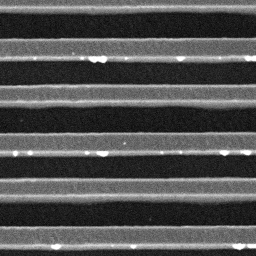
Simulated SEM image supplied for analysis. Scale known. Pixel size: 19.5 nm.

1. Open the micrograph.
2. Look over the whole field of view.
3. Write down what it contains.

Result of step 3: lines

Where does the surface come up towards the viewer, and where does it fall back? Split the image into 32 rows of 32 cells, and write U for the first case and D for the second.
UUUUUUUUUUUUUUUUUUUUUUUUUUUUUUUU
DDDDDDDDDDDDDDDDDDDDDDDDDDDDDDDD
DDDDDDDDDDDDDDDDDDDDDDDDDDDDDDDD
DDDDDDDDDDDDDDDDDDDDDDDDDDDDDDDD
DDDDDDDDDDDDDDDDDDDDDDDDDDDDDDDD
UUUUUUUUUUUUUUUUUUUUUUUUUUUUUUUU
UUUUUUUUUUUUUUUUUUUUUUUUUUUUUUUU
DDDDDDDDDDDUUDDDDDDDDDDDDDDDDDDU
DDDDDDDDDDDDDDDDDDDDDDDDDDDDDDDD
DDDDDDDDDDDDDDDDDDDDDDDDDDDDDDDD
DDDDDDDDDDDDDDDDDDDDDDDDDDDDDDDD
UUUUUUUUUUUUUUUUUUUUUUUUUUUUUUUU
UUUUUUUUUUUUUUUUUUUUUUUUUUUUUUUU
DDDDDDDDDDDDDDDDDDDDDDDDDDDDDDDD
DDDDDDDDDDDDDDDDDDDDDDDDDDDDDDDD
DDDDDDDDDDDDDDDDDDDDDDDDDDDDDDDD
DDDDDDDDDDDDDDDDDDDDDDDDDDDDDDDD
UUUUUUUUUUUUUUUUUUUUUUUUUUUUUUUU
UUUUUUUUUUUUUUUUUUUUUUUUUUUUUUUU
DDDDDDDDDDDDDDDDDDDDDDDDDDDDDDDD
DDDDDDDDDDDDDDDDDDDDDDDDDDDDDDDD
DDDDDDDDDDDDDDDDDDDDDDDDDDDDDDDD
UUUUUUUUUUUUUUUUUUUUUUUUUUUUUUUU
UUUUUUUUUUUUUUUUUUUUUUUUUUUUUUUU
UUUUUUUUUUUUUUUUDDUUUDUUUUUUUDDD
DDDDDDDDDDDDDDDDDDDDDDDDDDDDDDDD
DDDDDDDDDDDDDDDDDDDDDDDDDDDDDDDD
DDDDDDDDDDDDDDDDDDDDDDDDDDDDDDDD
UUUUUUUUUUUUUUUUUUUUUUUUUUUUUUUU
UUUUUUUUUUUUUUUUUUUUUUUUUUUUUUUU
UUUUUUUUUUUUUUUUUUUUUUUUUUUUUUUU
DDDDDDDDDDDDDDDDDDDDDDDDDDDDDDDD